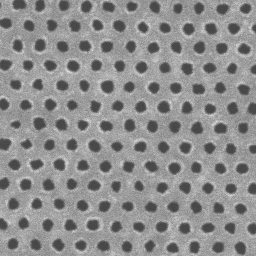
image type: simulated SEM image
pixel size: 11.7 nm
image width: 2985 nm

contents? a regular array of holes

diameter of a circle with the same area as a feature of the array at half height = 135 nm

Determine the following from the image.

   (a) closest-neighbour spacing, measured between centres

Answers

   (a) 257 nanometers